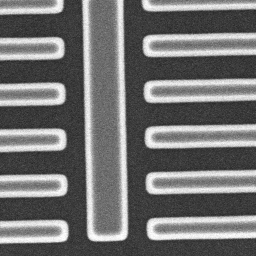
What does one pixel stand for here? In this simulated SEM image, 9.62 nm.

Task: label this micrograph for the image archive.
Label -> groups of lines, slits or small figures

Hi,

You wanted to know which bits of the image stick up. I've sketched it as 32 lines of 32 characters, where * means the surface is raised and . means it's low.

********...****...**************
*..........****.................
...........****.................
...........****.................
...........****...........******
********...****...**************
********...****....************.
...........****.................
...........****.................
...........****.................
...........****....*************
********...****...**************
********...****....***..........
...........****.................
...........****.................
...........****.................
*******....****....*************
********...****....*************
*******....****.................
...........****.................
...........****.................
...........*****................
********...*****...*************
********...*****...*************
...........*****................
...........*****................
...........*****................
...........*****.......*********
********...*****...*************
********...****....**********...
................................
................................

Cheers